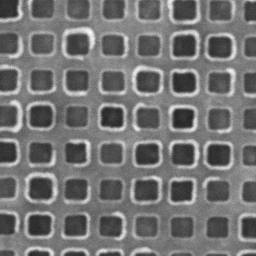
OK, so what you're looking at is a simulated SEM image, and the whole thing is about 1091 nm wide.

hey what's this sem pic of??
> a regular array of holes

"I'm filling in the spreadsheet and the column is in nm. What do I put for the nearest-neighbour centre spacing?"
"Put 151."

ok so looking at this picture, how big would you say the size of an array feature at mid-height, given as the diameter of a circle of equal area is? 0.107 µm